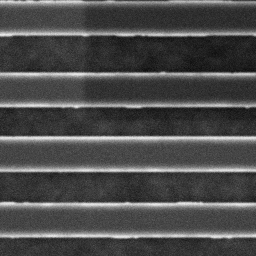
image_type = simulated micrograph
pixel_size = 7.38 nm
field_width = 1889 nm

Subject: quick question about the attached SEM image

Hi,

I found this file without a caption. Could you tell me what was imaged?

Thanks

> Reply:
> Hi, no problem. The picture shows lines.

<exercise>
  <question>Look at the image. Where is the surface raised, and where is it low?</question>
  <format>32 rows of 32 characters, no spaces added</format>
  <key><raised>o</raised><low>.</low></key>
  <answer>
oooooooooooooooooooooooooooooooo
oooooooooooooooooooooooooooooooo
oooooooooooooooooooooooooooooooo
oooooooooooooooooooooooooooooooo
................................
................................
................................
................................
................................
oooooooooooooooooooooooooooooooo
oooooooooooooooooooooooooooooooo
oooooooooooooooooooooooooooooooo
oooooooooooooooooooooooooooooooo
................................
................................
................................
................................
oooooooooooooooooooooooooooooooo
oooooooooooooooooooooooooooooooo
oooooooooooooooooooooooooooooooo
oooooooooooooooooooooooooooooooo
................................
................................
................................
................................
oooooooooooooooooooooooooooooooo
oooooooooooooooooooooooooooooooo
oooooooooooooooooooooooooooooooo
oooooooooooooooooooooooooooooooo
oooooooooooooooooooooooooooooooo
................................
................................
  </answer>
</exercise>